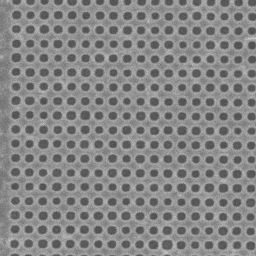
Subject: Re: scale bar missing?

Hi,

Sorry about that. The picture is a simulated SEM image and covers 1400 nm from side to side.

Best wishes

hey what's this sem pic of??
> a regular array of holes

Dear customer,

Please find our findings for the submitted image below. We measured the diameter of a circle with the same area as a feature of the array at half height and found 0.0494 micrometres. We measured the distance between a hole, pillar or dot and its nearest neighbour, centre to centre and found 75 nm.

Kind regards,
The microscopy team